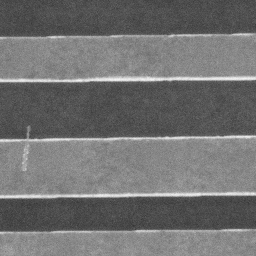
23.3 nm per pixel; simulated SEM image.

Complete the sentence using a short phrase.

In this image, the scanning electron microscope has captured lines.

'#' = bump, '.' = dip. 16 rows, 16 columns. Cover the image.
................
................
################
################
################
................
................
................
................
################
################
################
................
................
...#############
################